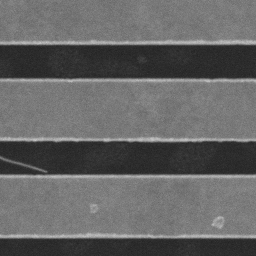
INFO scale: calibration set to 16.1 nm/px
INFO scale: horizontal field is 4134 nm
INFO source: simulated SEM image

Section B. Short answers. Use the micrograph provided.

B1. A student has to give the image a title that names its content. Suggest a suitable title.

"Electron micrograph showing lines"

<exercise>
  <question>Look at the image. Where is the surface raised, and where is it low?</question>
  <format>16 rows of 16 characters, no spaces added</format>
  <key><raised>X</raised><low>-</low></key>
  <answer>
XXXXXXXXXXXXXXXX
XXXXXXXXXXXXXXXX
XXXXXXXXXXXXXXXX
----------------
----------------
XXXXXXXXXXXXXXXX
XXXXXXXXXXXXXXXX
XXXXXXXXXXXXXXXX
XXXXXXXXXXXXXXXX
----------------
----------------
XXXXXXXXXXXXXXXX
XXXXXXXXXXXXXXXX
XXXXXXXXXXXXXXXX
XXXXXXXXXXXXXXXX
----------------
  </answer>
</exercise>